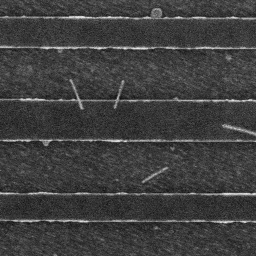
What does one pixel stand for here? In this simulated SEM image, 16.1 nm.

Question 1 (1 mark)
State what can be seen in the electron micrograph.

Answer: lines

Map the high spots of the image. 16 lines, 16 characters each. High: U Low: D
DDDDDDDDDDDDDDDD
UUUUUUUUUUUUUUUU
UUUUUUUUUUUUUUUU
DDDDDDDDDDDDDDDD
DDDDDDDDDDDDDDDD
DDDDDDDDDDDDDDDD
UUUUUUUUUUUUUUUU
UUUUUUUUUUUUUUUU
UUUUUUUUUUUUUUUU
DDDDDDDDDDDDDDDD
DDDDDDDDDDDDDDDD
DDDDDDDDDDDDDDDD
UUUUUUUUUUUUUUUU
UUUUUUUUUUUUUUUU
DDDDDDDDDDDDDDDD
DDDDDDDDDDDDDDDD